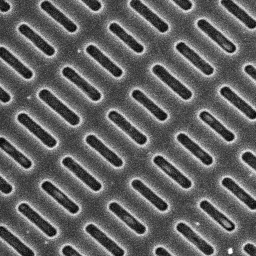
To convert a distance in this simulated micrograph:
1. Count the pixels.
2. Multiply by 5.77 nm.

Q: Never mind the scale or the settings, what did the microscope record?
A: a regular array of holes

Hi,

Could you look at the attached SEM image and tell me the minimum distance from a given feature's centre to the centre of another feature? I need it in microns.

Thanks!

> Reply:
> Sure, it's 0.184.